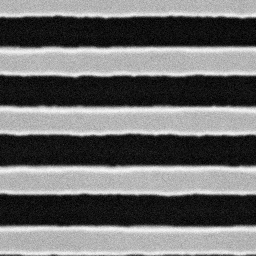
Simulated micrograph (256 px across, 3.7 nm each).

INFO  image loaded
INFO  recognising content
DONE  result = lines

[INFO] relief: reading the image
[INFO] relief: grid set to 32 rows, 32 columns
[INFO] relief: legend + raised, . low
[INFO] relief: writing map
++++++++++++++++++++++++++++++++
++++++++++++++++++++++++++++++++
................................
................................
................................
................................
++++++++++++++++++++++++++++++++
++++++++++++++++++++++++++++++++
++++++++++++++++++++++++++++++++
.........+......................
................................
................................
................................
++........................++....
++++++++++++++++++++++++++++++++
++++++++++++++++++++++++++++++++
++++++++++++++++++++++++++++++++
................................
................................
................................
................................
++++++++++++++++++++++++++++++++
++++++++++++++++++++++++++++++++
++++++++++++++++++++++++++++++++
................................
................................
................................
................................
++++++++++++++++++++++++++++++++
++++++++++++++++++++++++++++++++
++++++++++++++++++++++++++++++++
++++++++++++++++++++++++++++++++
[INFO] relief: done